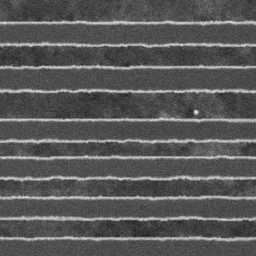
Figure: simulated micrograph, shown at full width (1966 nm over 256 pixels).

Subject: lines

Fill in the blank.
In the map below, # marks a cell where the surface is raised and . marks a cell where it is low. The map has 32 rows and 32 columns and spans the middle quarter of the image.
................................
################################
################################
################################
################################
################################
################################
................................
................................
................................
................................
................................
................................
................................
################################
################################
################################
################################
################################
................................
................................
................................
................................
##..###.##.####.#.##...####..###
################################
################################
################################
################################
##.####.#....#######.######....#
................................
................................
................................